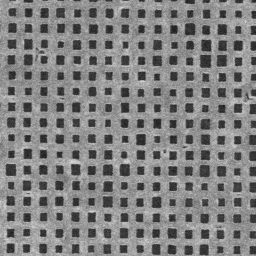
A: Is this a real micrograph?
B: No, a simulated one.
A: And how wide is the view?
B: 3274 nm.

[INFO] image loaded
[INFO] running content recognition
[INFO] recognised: a regular array of holes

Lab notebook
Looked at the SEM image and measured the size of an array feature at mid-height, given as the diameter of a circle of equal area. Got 122 nm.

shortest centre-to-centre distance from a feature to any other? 196 nm